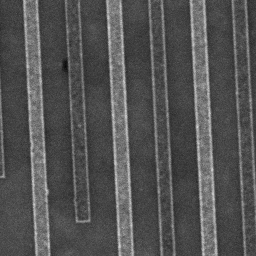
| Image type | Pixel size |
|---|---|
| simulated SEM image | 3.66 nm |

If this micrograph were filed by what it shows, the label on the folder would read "parallel lines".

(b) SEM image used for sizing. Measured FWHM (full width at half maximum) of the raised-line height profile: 50.3 nm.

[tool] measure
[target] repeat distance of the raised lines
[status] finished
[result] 0.152 µm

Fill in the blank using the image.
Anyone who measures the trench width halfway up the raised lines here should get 0.103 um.